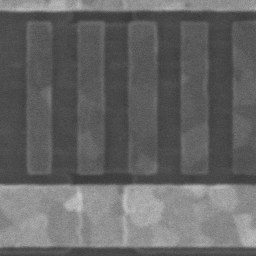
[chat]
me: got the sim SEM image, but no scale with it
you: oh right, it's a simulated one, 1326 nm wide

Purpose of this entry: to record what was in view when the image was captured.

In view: wiring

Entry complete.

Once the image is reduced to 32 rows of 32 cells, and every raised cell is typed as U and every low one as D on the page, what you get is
UUUUUUUUUUDDDDDDUUUUUUUUUUUUUUUU
DDDDDDDDDDDDDDDDDDDDDDDDDDDDDDDD
DDDDDDDDDDDDDDDDDDDDDDDDDDDDDDDD
DDDUUUDDDDUUUDDDUUUDDDDUUUDDDUUU
DDDUUUDDDDUUUDDDUUUDDDDUUUDDDUUU
DDDDUUDDDDUUUDDDUUUDDDDUUUDDDUUU
DDDDUUDDDDUUUDDDUUUDDDDUUUDDDUUU
DDDUUUDDDDUUUDDDUUUDDDDUUUDDDUUU
DDDUUUDDDDUUUDDDUUUDDDDUUUDDDUUU
DDDUUUDDDDUUUDDDUUUUDDDUUUDDDUUU
DDDUUUDDDDUUUDDDUUUUDDDUUUDDDUUU
DDDUUUDDDDUUUDDDUUUDDDDUUUDDDUUU
DDDUUUDDDDUUUDDDUUUDDDDUUUDDDUUU
DDDUUUDDDDUUUDDDUUUDDDDUUUDDDUUU
DDDUUUDDDDUUUDDDUUUUDDDUUUDDDUUU
DDDUUUDDDDUUUDDDUUUUDDDUUUDDDUUU
DDDDUUDDDDUUUDDDUUUDDDDUUUDDDUUU
DDDUUUDDDDUUUDDDUUUUDDDUUUDDDUUU
DDDDUUDDDDUUUDDDUUUUDDDUUUDDDUUU
DDDUUUDDDDUUUDDDUUUDDDDUUUDDDUUU
DDDDUUDDDDUUUDDDUUUDDDDUUUDDDUUU
DDDDUUDDDDUUUDDDDUUDDDDUUUDDDUUU
DDDDDDDDDDDDDDDDDDDDDDDDDDDDDDDD
UUUUUUUUUUDDDDDDUUUUUUUUUUUUUUUU
UUUUUUUUUUDDDDDDUUUUUUUUUUUUUUUU
UUUUUUUUUUDDDDDDUUUUUUUUUUUUUUUU
UUUUUUUUUUDDDDDDUUUUUUUUUUUUUUUU
UUUUUUUUUUDDDDDDUUUUUUUUUUUUUUUU
UUUUUUUUUUDDDDDDUUUUUUUUUUUUUUUU
UUUUUUUUUUDDDDDDUUUUUUUUUUUUUUUU
UUUUUUUUUUDDDDDDUUUUUUUUUUUUUUUU
DDDDDDDDDDDDDDDDDDDDDDDDDDDDDDDD